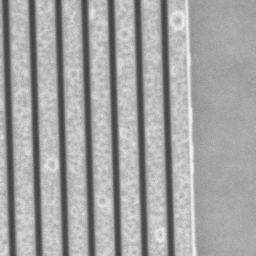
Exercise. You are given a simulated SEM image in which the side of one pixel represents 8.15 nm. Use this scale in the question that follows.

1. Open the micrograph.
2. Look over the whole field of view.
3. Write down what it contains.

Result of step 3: parallel lines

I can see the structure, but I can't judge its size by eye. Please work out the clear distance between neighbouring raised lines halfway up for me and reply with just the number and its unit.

0.0529 micrometres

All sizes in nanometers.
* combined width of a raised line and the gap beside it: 215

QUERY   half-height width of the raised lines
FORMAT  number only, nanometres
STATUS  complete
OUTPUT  159